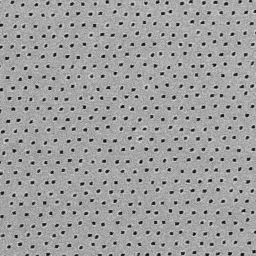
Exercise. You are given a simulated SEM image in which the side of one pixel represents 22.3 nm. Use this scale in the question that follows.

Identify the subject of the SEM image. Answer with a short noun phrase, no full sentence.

a regular array of holes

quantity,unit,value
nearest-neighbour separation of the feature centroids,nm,230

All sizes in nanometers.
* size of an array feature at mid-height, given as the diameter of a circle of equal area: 94.2